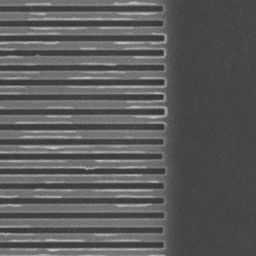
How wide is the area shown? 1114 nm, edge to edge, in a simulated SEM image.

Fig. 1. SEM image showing parallel lines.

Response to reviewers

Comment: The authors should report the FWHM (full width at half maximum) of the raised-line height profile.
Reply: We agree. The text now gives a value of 36.4 nanometers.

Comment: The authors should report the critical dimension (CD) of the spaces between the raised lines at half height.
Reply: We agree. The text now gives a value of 28.8 nm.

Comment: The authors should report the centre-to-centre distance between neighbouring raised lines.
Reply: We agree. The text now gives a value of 14.8 pixels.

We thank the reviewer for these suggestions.